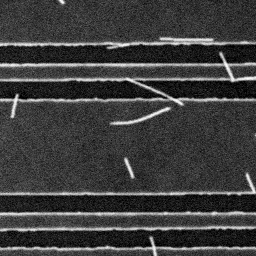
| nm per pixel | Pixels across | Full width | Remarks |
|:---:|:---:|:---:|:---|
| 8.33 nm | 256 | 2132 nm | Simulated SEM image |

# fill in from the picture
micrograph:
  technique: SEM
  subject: lines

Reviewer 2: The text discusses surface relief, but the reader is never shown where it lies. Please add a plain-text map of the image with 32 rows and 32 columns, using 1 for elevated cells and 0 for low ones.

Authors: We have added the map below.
11111111111111111111111111111111
11111111111111111111111111111111
11111111111111111111111111111111
11111111111111111111111111111111
11111111111111111111111111111111
11111111111111111111111101111000
00000000000000000000000000000000
00000000000000000000000000000000
11111111111111111111111111111111
11111111111111111111111111111111
00000000000000000000000000000000
00000000000000000000000000000000
11111111111111111111111111111111
11111111111111111111111111111111
11111111111111111111111111111111
11111111111111111111111111111111
11111111111111111111111111111111
11111111111111111111111111111111
11111111111111111111111111111111
11111111111111111111111111111111
11111111111111111111111111111111
11111111111111111111111111111111
11111111111111111111111111111111
11111111111111111111111111111111
00000000000000000000000000000000
00000000000000000000000000000000
00000000000000000000000000000000
11111111111111111111111111111111
11111111111111111111111111110111
00000000000000000000000000000000
00000000000000000000000000000000
11111111111111111111111111111111